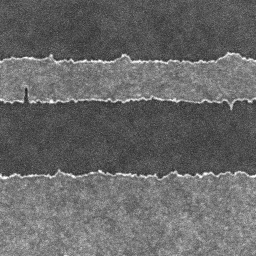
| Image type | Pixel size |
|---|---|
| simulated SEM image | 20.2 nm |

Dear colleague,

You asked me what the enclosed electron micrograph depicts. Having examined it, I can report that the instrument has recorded one or a few lines or trenches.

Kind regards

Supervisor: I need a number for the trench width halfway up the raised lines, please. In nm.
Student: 1480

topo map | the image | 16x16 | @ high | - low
----------------
----------------
----------------
--------------@-
@@@@@@@@@@@@@@@@
@@@@@@@@@@@@@@@@
----------------
----------------
----------------
----------------
----------------
@@@@@@@@@@@@@@@@
@@@@@@@@@@@@@@@@
@@@@@@@@@@@@@@@@
@@@@@@@@@@@@@@@@
@@@@@@@@@@@@@@@@